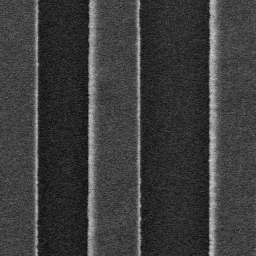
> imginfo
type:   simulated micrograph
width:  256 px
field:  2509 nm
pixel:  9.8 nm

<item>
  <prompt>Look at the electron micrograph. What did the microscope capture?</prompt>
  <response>lines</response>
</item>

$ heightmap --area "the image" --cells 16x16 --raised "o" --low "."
oo....ooo....ooo
oo....ooo....ooo
oo....ooo....ooo
oo....ooo....ooo
oo....ooo....ooo
oo....ooo....ooo
oo....ooo....ooo
oo....ooo....ooo
oo....ooo....ooo
oo....ooo....ooo
oo....ooo....ooo
oo....ooo....ooo
oo....ooo....ooo
oo....ooo....ooo
oo....ooo....ooo
oo....ooo....ooo